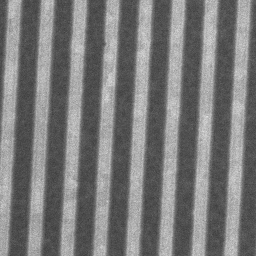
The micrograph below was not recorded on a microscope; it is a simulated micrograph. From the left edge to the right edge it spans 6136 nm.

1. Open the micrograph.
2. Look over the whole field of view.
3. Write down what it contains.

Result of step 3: parallel lines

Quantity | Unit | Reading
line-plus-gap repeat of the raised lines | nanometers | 785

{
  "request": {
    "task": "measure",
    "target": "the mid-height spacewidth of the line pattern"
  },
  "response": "434 nm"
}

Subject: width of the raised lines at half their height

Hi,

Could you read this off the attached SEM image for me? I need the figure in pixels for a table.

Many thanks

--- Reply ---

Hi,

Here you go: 14.5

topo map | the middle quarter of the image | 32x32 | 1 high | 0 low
00111000001110000011100000111100
00111000001110000011100000111000
00111000001110000011100000111000
01111000001110000011100000111000
01111000001110000011100000111000
01111000001110000011100000111000
01111000011110000011100000111000
01111000011110000011100000111000
01110000011110000111100000111000
01110000011110000111100000111000
01110000011110000111100000111000
01110000011110000111100000111000
01110000011110000111100000111000
01110000011100000111100000111000
01110000011100000111100001111000
01110000011100000111100001111000
01110000011100000111000001111000
01110000011100000111000001111000
11110000011100000111000001111000
11110000011100000111000001110000
11110000011100000111000001111000
11110000011100000111000001111000
11110000011100000111000001110000
11110000111100000111000001110000
11110000111100000111000001110000
11110000111100000111000001110000
11110000111100000111000001110000
11110000111100001111000001110000
11110000111100001111000001110000
11100000111100001111000001110000
11100000111100001111000001110000
11100000111100001111000001110000